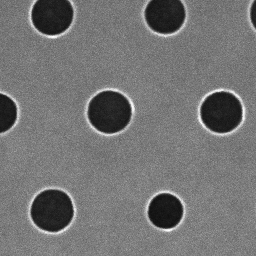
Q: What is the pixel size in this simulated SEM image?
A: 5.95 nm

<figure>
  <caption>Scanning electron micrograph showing holes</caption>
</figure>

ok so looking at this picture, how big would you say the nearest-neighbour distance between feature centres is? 113 pixels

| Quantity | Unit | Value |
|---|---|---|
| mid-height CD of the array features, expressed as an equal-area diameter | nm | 252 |